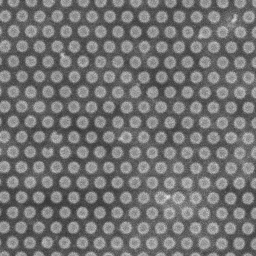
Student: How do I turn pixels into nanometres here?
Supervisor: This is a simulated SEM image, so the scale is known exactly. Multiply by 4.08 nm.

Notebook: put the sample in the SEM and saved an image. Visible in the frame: a regular array of raised bodies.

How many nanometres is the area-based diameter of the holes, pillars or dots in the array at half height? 45.4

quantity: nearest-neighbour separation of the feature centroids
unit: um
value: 0.0698